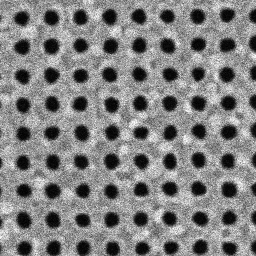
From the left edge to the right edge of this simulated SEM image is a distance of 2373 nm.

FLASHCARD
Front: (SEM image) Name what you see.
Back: a regular array of holes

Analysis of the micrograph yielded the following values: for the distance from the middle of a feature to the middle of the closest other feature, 0.263 microns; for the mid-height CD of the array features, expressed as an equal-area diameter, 0.139 µm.